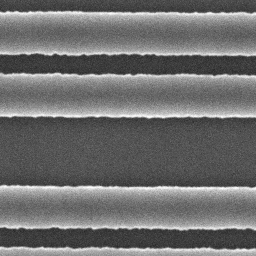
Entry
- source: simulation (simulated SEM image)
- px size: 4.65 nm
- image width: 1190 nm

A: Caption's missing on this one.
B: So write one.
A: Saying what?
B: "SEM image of lines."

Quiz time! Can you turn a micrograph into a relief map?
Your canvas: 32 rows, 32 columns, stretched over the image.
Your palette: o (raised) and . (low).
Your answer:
................................
................................
oooooooooooooooooooooooooooooooo
oooooooooooooooooooooooooooooooo
oooooooooooooooooooooooooooooooo
oooooooooooooooooooooooooooooooo
oooooooooooooooooooooooooooooooo
................................
................................
oooooooooooooooooooooooooooooooo
oooooooooooooooooooooooooooooooo
oooooooooooooooooooooooooooooooo
oooooooooooooooooooooooooooooooo
oooooooooooooooooooooooooooooooo
....o.o.ooo.oooooooooooooooooooo
................................
................................
................................
................................
................................
................................
................................
................................
oooooooooooooooooooooooooooooooo
oooooooooooooooooooooooooooooooo
oooooooooooooooooooooooooooooooo
oooooooooooooooooooooooooooooooo
oooooooooooooooooooooooooooooooo
...o..........o.o.o..ooooooo..oo
................................
................................
oooooooooooooooooooooooooooooooo